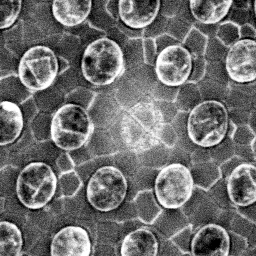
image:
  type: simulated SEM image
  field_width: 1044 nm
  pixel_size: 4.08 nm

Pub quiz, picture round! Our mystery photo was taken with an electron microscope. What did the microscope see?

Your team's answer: a regular array of raised bodies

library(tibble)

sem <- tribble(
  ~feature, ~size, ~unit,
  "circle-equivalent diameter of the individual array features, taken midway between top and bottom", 41.2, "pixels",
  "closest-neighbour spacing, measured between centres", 274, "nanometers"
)